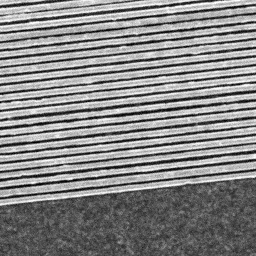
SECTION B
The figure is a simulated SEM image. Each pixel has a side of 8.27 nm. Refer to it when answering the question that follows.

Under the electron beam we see parallel lines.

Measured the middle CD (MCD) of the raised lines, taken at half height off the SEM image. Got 0.04 um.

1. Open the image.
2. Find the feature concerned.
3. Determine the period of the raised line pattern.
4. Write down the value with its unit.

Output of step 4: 71.3 nanometres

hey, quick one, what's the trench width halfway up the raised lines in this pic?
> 3.72 pixels